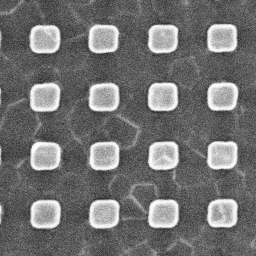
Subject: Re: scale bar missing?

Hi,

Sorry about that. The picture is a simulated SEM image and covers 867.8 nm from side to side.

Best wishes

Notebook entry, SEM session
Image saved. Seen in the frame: a regular array of raised bodies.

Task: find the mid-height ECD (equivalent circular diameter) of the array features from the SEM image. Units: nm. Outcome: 101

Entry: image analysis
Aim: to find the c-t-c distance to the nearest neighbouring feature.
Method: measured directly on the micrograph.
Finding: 198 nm